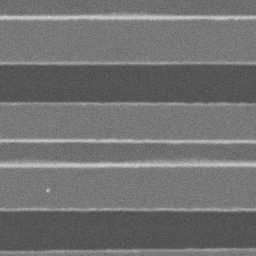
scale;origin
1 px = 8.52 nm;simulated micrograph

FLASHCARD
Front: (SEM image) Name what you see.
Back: lines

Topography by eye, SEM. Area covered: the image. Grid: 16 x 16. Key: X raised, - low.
XXXXXXXXXXXXXXXX
XXXXXXXXXXXXXXXX
XXXXXXXXXXXXXXXX
XXXXXXXXXXXXXXXX
----------------
----------------
XXXXXXXXXXXXXXX-
XXXXXXXXXXXXXXXX
XXXXXXXXXXXXXXXX
XXXXXXXXXXXXXXXX
XXXXXXXXXXXXXXXX
XXXXXXXXXXXXXXXX
XXXXXXXXXXXXXXXX
----------------
----------------
----------------